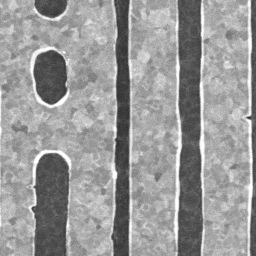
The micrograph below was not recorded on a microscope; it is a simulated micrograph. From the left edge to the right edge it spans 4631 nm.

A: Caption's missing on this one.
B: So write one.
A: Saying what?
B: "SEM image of one or a few lines or trenches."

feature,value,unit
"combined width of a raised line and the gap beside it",1250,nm